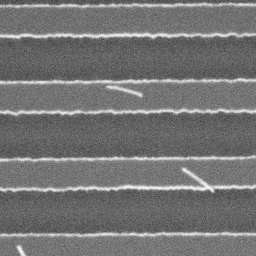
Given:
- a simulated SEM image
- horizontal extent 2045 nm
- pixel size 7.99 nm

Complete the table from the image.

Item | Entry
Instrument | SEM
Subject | lines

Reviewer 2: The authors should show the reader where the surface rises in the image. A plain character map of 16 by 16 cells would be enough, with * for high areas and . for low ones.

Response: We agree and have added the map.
****************
****************
................
................
................
****************
****************
................
................
................
****************
****************
................
................
................
****************